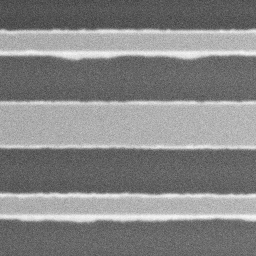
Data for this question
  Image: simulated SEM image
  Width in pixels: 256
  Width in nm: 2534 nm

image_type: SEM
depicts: lines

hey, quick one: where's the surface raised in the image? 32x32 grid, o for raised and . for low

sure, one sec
................................
................................
................................
................................
oooooooooooooooooooooooooooooooo
oooooooooooooooooooooooooooooooo
oooooooooooooooooooooooooooooooo
................................
................................
................................
................................
................................
................................
oooooooooooooooooooooooooooooooo
oooooooooooooooooooooooooooooooo
oooooooooooooooooooooooooooooooo
oooooooooooooooooooooooooooooooo
oooooooooooooooooooooooooooooooo
..........................o....o
................................
................................
................................
................................
................................
oooooooooooooooooooooooooooooooo
oooooooooooooooooooooooooooooooo
oooooooooooooooooooooooooooooooo
................................
................................
................................
................................
................................